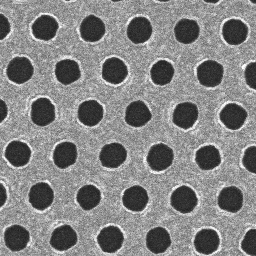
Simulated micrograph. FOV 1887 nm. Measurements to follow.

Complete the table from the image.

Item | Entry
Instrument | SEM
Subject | a regular array of holes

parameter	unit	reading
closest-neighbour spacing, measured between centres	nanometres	348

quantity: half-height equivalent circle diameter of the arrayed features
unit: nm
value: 186